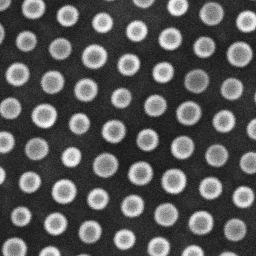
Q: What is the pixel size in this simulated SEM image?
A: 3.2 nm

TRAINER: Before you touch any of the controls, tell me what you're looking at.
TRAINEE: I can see a regular array of raised bodies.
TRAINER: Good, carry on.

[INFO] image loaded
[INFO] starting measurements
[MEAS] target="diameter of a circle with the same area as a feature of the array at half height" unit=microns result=0.0664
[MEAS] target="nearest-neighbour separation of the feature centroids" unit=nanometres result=109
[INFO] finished